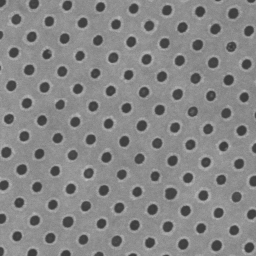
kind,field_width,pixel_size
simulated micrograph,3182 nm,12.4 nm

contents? a regular array of holes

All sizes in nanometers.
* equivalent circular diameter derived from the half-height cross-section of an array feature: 134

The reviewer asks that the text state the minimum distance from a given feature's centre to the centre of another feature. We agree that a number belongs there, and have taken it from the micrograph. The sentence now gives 287 nanometres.